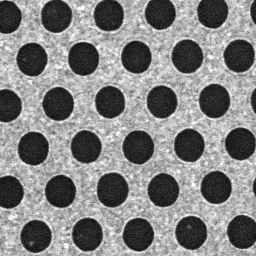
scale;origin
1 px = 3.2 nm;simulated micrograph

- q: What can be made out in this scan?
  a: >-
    a regular array of holes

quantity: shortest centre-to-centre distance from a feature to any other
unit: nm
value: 162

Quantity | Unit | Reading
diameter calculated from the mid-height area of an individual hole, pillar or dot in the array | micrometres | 0.107